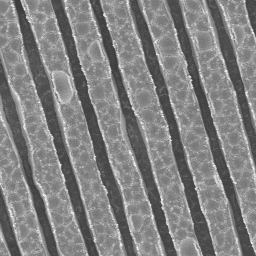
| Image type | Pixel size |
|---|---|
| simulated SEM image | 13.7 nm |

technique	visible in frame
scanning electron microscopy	parallel lines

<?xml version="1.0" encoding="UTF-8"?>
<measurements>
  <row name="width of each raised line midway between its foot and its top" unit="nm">352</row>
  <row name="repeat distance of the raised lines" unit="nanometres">510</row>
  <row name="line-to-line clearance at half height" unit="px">11.5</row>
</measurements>